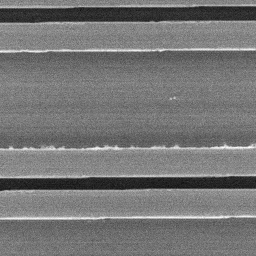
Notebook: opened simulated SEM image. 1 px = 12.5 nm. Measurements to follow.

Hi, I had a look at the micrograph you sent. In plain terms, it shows lines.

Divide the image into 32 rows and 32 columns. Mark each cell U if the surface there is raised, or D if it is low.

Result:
UUUUUUUUUUUUUUUUUUUUUUUUUUUUUUUU
DDDDDDDDDDDDDDDDDDDDDDDDDDDDDDDD
DDDDDDDDDDDDDDDDDDDDDDDDDDDDDDDD
UUUUUUUUUUUUUUUUUUUUUUUUUUUUUUUU
UUUUUUUUUUUUUUUUUUUUUUUUUUUUUUUU
UUUUUUUUUUUUUUUUUUUUUUUUUUUUUUUU
DDDDDDDDDDDDDDDDDDDDDDDDDDDDDDDD
DDDDDDDDDDDDDDDDDDDDDDDDDDDDDDDD
DDDDDDDDDDDDDDDDDDDDDDDDDDDDDDDD
DDDDDDDDDDDDDDDDDDDDDDDDDDDDDDDD
DDDDDDDDDDDDDDDDDDDDDDDDDDDDDDDD
DDDDDDDDDDDDDDDDDDDDDDDDDDDDDDDD
DDDDDDDDDDDDDDDDDDDDDDDDDDDDDDDD
DDDDDDDDDDDDDDDDDDDDDDDDDDDDDDDD
DDDDDDDDDDDDDDDDDDDDDDDDDDDDDDDD
DDDDDDDDDDDDDDDDDDDDDDDDDDDDDDDD
DDDDDDDDDDDDDDDDDDDDDDDDDDDDDDDD
DDDDDDDDDDDDDDDDDDDDDDDDDDDDDDDD
DDDDDDDDDDDDDDDDDDDDDDDDDDDUUUUU
UUUUUUUUUUUUUUUUUUUUUUUUUUUUUUUU
UUUUUUUUUUUUUUUUUUUUUUUUUUUUUUUU
UUUUUUUUUUUUUUUUUUUUUUUUUUUUUUUU
DDDDDDDDDDDDDDDDDDDDDDDDDDDDDDDD
DDDDDDDDDDDDDDDDDDDDDDDDDDDDDDDD
UUUUUUUUUUUUUUUUUUUUUUUUUUUUUUUU
UUUUUUUUUUUUUUUUUUUUUUUUUUUUUUUU
UUUUUUUUUUUUUUUUUUUUUUUUUUUUUUUU
DDDDDDDDDDDDDDDDDDDDDDDDDDDDDDDD
DDDDDDDDDDDDDDDDDDDDDDDDDDDDDDDD
DDDDDDDDDDDDDDDDDDDDDDDDDDDDDDDD
DDDDDDDDDDDDDDDDDDDDDDDDDDDDDDDD
DDDDDDDDDDDDDDDDDDDDDDDDDDDDDDDD